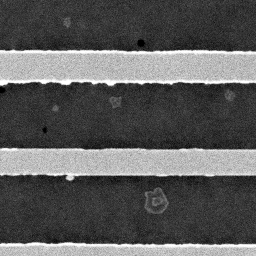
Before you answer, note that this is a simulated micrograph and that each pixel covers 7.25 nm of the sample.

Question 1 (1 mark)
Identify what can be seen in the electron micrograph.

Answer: lines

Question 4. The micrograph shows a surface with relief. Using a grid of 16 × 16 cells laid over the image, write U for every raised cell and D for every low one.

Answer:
DDDDDDDDDDDDDDDD
DDDDDDDDDDDDDDDD
DDDDDDDDDDDDDDDD
UUUUUUUUUUUUUUUU
UUUUUUUUUUUUUUUU
DDDDDDDDDDDDDDDD
DDDDDDDDDDDDDDDD
DDDDDDDDDDDDDDDD
DDDDDDDDDDDDDDDD
UUUUUUUUUUUUUUUU
UUUUUUUUUUUUUUUU
DDDDDDDDDDDDDDDD
DDDDDDDDDDDDDDDD
DDDDDDDDDDDDDDDD
DDDDDDDDDDDDDDDD
UUUUUUUUUUUUUUUU